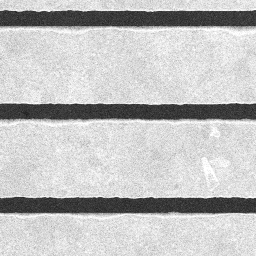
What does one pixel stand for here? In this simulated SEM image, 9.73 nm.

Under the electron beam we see lines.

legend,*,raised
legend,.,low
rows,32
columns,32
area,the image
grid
********************************
................................
................................
*******....******..**********...
********************************
********************************
********************************
********************************
********************************
********************************
********************************
********************************
********************************
................................
................................
********************************
********************************
********************************
********************************
********************************
********************************
********************************
********************************
********************************
********************************
................................
................................
********************************
********************************
********************************
********************************
********************************